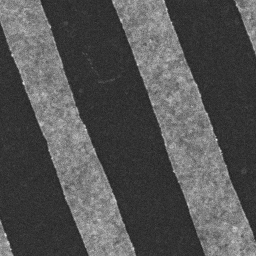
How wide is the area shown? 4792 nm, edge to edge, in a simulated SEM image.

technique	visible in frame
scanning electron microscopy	one or a few lines or trenches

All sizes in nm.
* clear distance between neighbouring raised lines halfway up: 1280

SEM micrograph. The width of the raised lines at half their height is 45.9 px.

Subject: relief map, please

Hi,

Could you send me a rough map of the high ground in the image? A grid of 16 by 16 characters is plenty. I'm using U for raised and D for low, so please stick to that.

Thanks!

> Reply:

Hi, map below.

UUUDDDDUUUDDDDDU
UUUDDDDDUUUDDDDU
UUUDDDDDUUUDDDDD
DUUUDDDDUUUUDDDD
DUUUDDDDDUUUDDDD
DDUUDDDDDUUUDDDD
DDUUUDDDDUUUUDDD
DDUUUDDDDDUUUDDD
DDDUUUDDDDUUUDDD
DDDUUUDDDDUUUUDD
DDDUUUDDDDDUUUDD
DDDDUUUDDDDUUUDD
DDDDUUUDDDDDUUUD
DDDDDUUUDDDDUUUD
DDDDDUUUDDDDUUUU
UDDDDUUUDDDDDUUU